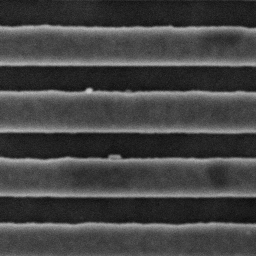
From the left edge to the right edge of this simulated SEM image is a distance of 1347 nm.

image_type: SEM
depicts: lines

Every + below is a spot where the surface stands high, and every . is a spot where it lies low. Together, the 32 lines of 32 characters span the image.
................................
................................
................................
++++++++++++++++++++++.++++++++.
++++++++++++++++++++++++++++++++
++++++++++++++++++++++++++++++++
++++++++++++++++++++++++++++++++
++++++++++++++++++++++++++++++++
................................
................................
................................
...+.+++..++++.....+...+++......
++++++++++++++++++++++++++++++++
++++++++++++++++++++++++++++++++
++++++++++++++++++++++++++++++++
++++++++++++++++++++++++++++++++
+...++++++.+++++++++++++++++++++
................................
................................
................................
++++++++++++++++++++++++++++++++
++++++++++++++++++++++++++++++++
++++++++++++++++++++++++++++++++
++++++++++++++++++++++++++++++++
............+++++++++++++++.....
................................
................................
................................
++++++++++++++++++++++++++++++++
++++++++++++++++++++++++++++++++
++++++++++++++++++++++++++++++++
++++++++++++++++++++++++++++++++